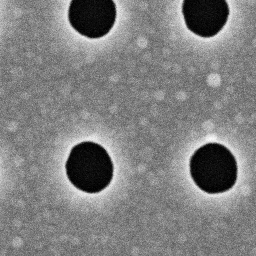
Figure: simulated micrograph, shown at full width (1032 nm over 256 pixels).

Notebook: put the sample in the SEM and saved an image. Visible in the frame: holes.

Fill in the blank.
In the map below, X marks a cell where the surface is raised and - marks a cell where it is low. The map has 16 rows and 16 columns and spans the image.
XXXX---XXXX---XX
XXXX---XXXXX--XX
XXXXXXXXXXXXXXXX
XXXXXXXXXXXXXXXX
XXXXXXXXXXXXXXXX
XXXXXXXXXXXXXXXX
XXXXXXXXXXXXXXXX
XXXXXXXXXXXXXXXX
XXXXXXXXXXXXXXXX
XXXX---XXXXX--XX
XXXX---XXXXX---X
XXXXX--XXXXX---X
XXXXXXXXXXXXXXXX
XXXXXXXXXXXXXXXX
XXXXXXXXXXXXXXXX
XXXXXXXXXXXXXXXX